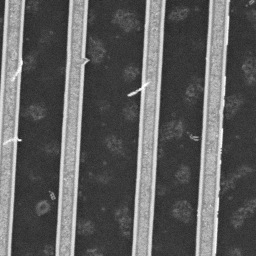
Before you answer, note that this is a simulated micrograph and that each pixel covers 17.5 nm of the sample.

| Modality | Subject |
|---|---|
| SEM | one or a few lines or trenches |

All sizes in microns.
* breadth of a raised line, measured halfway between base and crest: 0.271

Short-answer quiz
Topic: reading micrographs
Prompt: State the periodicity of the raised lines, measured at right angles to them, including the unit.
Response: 69 pixels